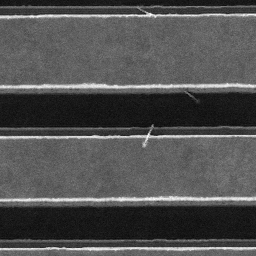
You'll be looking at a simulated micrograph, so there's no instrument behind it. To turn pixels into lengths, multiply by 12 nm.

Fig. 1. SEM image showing lines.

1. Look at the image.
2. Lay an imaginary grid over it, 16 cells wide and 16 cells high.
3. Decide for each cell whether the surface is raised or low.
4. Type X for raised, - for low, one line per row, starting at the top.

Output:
----------------
XXXXXXXXXXXXXXXX
XXXXXXXXXXXXXXXX
XXXXXXXXXXXXXXXX
XXXXXXXXXXXXXXXX
----------------
----------------
----------------
-----XXXXXXXXXXX
XXXXXXXXXXXXXXXX
XXXXXXXXXXXXXXXX
XXXXXXXXXXXXXXXX
XXXXXXXXXXXXXXXX
----------------
----------------
--XXXXXXXXXXXXXX